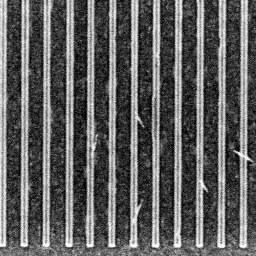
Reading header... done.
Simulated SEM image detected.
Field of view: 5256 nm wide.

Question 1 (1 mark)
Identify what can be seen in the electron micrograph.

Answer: parallel lines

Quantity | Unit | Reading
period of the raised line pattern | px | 21.9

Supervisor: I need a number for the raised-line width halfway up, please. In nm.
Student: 100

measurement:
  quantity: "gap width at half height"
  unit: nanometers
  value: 352